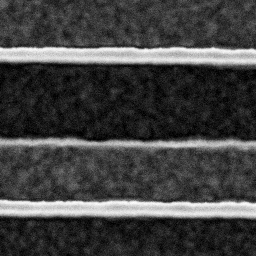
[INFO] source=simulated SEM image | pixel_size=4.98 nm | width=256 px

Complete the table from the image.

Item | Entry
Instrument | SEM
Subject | lines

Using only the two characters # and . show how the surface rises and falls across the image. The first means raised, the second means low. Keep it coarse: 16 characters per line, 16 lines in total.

################
################
################
################
................
................
................
................
................
################
################
################
################
................
................
................